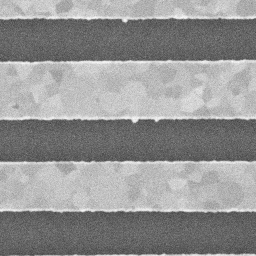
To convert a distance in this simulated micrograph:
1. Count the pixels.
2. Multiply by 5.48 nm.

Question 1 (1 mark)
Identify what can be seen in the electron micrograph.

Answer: lines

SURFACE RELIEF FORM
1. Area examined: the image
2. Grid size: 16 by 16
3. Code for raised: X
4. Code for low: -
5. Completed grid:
XXXXXXXXXXXXXXXX
----------------
----------------
----------------
XXXXXXXXXXXXXXXX
XXXXXXXXXXXXXXXX
XXXXXXXXXXXXXXXX
----------------
----------------
----------------
XXXXXXXXXXXXXXXX
XXXXXXXXXXXXXXXX
XXXXXXXXXXXXXXXX
----------------
----------------
----------------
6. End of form